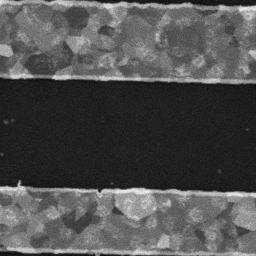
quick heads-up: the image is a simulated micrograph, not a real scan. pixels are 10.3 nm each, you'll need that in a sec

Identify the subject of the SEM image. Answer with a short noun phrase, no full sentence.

one or a few lines or trenches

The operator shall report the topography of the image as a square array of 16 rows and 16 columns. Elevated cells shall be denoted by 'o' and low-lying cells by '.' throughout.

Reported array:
ooooooooooooo...
oooooooooooooooo
oooooooooooooooo
oooooooooooooooo
oooooooooooooooo
................
................
................
................
................
................
................
oooooooooooooooo
oooooooooooooooo
oooooooooooooooo
oooooooooooooooo